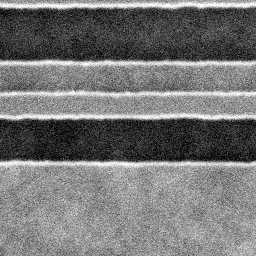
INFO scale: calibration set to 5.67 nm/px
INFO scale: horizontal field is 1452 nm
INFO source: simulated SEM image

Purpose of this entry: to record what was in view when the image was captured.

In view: lines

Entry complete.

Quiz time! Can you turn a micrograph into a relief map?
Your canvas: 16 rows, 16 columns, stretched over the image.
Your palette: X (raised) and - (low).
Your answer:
----------------
----------------
----------------
----------------
XXXXXXXXXXXXXXXX
XXXXXXXXXXXXXXXX
XXXXXXXXXXXXXXXX
----------------
----------------
----------------
XXXXXXXXXXXXXXXX
XXXXXXXXXXXXXXXX
XXXXXXXXXXXXXXXX
XXXXXXXXXXXXXXXX
XXXXXXXXXXXXXXXX
XXXXXXXXXXXXXXXX